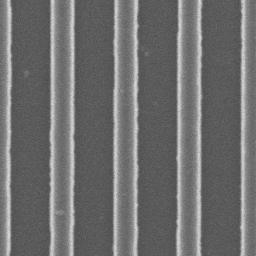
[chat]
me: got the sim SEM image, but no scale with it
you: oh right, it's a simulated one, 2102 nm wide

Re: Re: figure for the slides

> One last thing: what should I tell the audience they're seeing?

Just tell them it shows lines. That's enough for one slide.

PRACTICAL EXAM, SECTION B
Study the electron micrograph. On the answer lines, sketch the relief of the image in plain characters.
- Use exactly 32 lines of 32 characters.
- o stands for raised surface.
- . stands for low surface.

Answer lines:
o.....ooo.....ooo.....ooo.....oo
o.....ooo.....ooo.....ooo.....oo
o.....ooo.....ooo.....ooo.....oo
o.....ooo.....ooo.....ooo.....oo
o.....ooo.....ooo.....ooo.....oo
o.....ooo.....ooo.....ooo.....oo
o.....ooo.....ooo.....ooo.....oo
o.....ooo.....ooo.....ooo.....oo
o.....ooo.....ooo.....ooo.....oo
o.....ooo.....ooo.....ooo.....oo
o.....ooo.....ooo.....ooo.....oo
o.....ooo.....ooo.....ooo.....oo
o.....ooo.....ooo.....ooo.....oo
o.....ooo.....ooo.....ooo.....oo
o.....ooo.....ooo.....ooo.....oo
o.....ooo.....ooo.....ooo.....oo
o.....ooo.....ooo.....ooo.....oo
o.....ooo.....ooo.....ooo.....oo
o.....ooo.....ooo.....ooo.....oo
o.....ooo.....ooo.....ooo.....oo
o.....ooo.....ooo.....ooo.....oo
o.....ooo.....ooo.....ooo.....oo
o.....ooo.....ooo.....ooo.....oo
o.....ooo.....ooo.....ooo.....oo
o.....ooo.....ooo.....ooo.....oo
o.....ooo.....ooo.....ooo.....oo
o.....ooo.....ooo.....ooo.....oo
o.....ooo.....ooo.....ooo.....oo
o.....ooo.....ooo.....ooo.....oo
o.....ooo.....ooo.....ooo.....oo
o.....ooo.....ooo.....ooo.....oo
o.....ooo.....ooo.....ooo.....oo